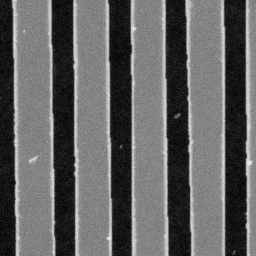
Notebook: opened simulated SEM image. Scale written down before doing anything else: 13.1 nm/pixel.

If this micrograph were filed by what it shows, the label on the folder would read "lines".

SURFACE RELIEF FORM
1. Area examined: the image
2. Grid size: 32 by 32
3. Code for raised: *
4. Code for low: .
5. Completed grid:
..****...****....***...*****...*
..****...****...****...*****...*
..****...*****..*****..*****...*
..****...*****...****..*****...*
..****...****...*****..*****...*
..****...*****...****..*****...*
..****...*****...****...****...*
..****...*****...****...****...*
..****...*****...****...****...*
..****...*****...****...****...*
..****...*****...****...****...*
..****...*****...****...****...*
..****...*****...****...****...*
..****...*****...****...****...*
..****...*****...****...****...*
..*****..*****...****...****...*
..****...*****...****...****...*
..*****..*****...****...****...*
..*****..*****...****...****...*
..*****..*****...****...****...*
..*****..*****...****...****...*
..*****..*****...****...****...*
..*****..*****...****...****...*
..*****..*****...****...****...*
..*****..*****...****...****...*
..*****..*****...****...****...*
..*****..*****...****...****...*
..*****..*****...****...****...*
..*****...****...****...****...*
..*****...****...****...****...*
..*****...****...****...****...*
..*****...****...****...****...*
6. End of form